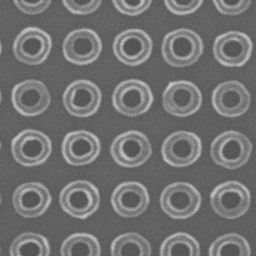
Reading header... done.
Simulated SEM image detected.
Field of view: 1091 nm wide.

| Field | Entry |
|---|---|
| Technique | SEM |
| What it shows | a regular array of ring-shaped raised bodies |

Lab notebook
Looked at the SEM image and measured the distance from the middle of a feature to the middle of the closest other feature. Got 210 nm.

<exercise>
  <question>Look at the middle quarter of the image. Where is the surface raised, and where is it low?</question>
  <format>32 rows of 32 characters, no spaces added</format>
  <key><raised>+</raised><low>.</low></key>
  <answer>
................................
................................
................................
................................
...+++.........+++++.......++++.
.+++++++......+++++++.....++++++
.++...+++....+++..++++...+++...+
+++....++...+++....+++...++.....
++.....++...+++....+++...++.....
++.....++...+++....+++...++.....
+++...+++....++...+++....+++...+
.+++++++......+++++++.....++++++
..+++++........++++........+++++
................................
................................
................................
................................
.++++++........++++........+++++
++++++++.....+++++++......++++++
++....+++...+++...+++....+++...+
++.....++...+++....+++...++.....
++.....++...+++....+++..+++.....
++...++++...+++....++....++.....
++++++++.....++++++++....++++.++
.+++++.......+++++++......++++++
...............+++...........+..
................................
................................
................................
..++++..........................
.++++++.......++++++......++++++
++++++++.....++++++++....+++++++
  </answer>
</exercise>